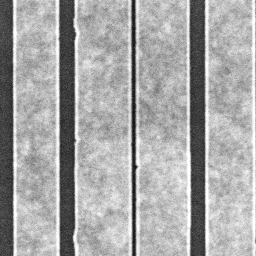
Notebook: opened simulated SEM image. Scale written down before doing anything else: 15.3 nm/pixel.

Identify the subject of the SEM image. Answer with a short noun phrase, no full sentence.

one or a few lines or trenches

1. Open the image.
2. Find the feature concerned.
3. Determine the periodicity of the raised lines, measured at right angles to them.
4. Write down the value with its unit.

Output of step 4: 990 nm